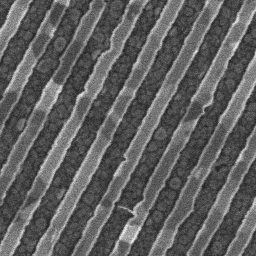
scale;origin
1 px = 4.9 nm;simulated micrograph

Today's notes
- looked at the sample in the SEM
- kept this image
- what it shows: parallel lines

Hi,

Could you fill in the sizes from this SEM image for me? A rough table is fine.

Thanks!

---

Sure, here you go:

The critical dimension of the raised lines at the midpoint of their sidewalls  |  66.6 nanometres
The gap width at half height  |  102 nm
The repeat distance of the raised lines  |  166 nm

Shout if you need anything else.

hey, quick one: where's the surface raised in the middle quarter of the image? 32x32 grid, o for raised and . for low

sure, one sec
oo......oooo......ooo......oooo.
oo......ooo......oooo......oooo.
o......oooo......oooo.....oooo..
o......ooo......oooo.....oooo...
......oooo......ooo......oooo...
.....ooooo.....oooo......ooo....
.....oooo......ooo......oooo....
....oooo......ooo......oooo.....
....oooo.....oooo......oooo.....
...oooo......ooo......oooo......
...ooo......oooo......ooo.......
...ooo......ooo......oooo......o
..ooo......oooo......ooo.......o
..ooo......oooo.....oooo......oo
.ooo......oooo......oooo.....ooo
oooo......ooo......oooo......ooo
ooo......oooo......ooo......oooo
ooo......ooo......oooo.oo...ooo.
oo......oooo......ooo..o...oooo.
o.......ooo......oooo......ooo..
o......oooo.....oooo......oooo..
.......ooo......oooo......ooo...
......oooo.....oooo......oooo...
......ooo......oooo......ooo....
.....oooo......ooo......oooo....
....oooo......oooo......ooo.....
....oooo......ooo......oooo.....
...oooo......ooo......oooo......
...oooo......ooo......oooo.....o
..oooo......oooo.....oooo..o...o
..ooo......oooo......oooo..o..oo
.oooo......ooo......oooo......oo